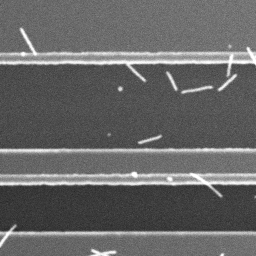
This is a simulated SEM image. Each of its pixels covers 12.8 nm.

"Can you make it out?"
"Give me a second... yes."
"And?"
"lines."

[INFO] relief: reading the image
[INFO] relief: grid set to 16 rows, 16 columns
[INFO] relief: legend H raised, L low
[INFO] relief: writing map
HHHHHHHHHHHHHHHH
HHHHHHHHHHHHHHHH
HHHHHHHHHHHHHHHH
HHHHHHHHHHHHHHHH
LLLLLLLLLLLLLLLL
LLLLLLLLLLLLLLLL
LLLLLLLLLLLLLLLL
LLLLLLLLLLLLLLLL
LLLLLLLLLLLLLLLL
HHHHHHHHHHHHHHHH
HHHHHHHHHHHHHHHH
HHLHLLLLHLHLLLLL
LLLLLLLLLLLLLLLL
LLLLLLLLLLLLLLLL
LLLLLLLLLLLLLLLL
HHHHHHHHHHHHHHHH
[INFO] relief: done